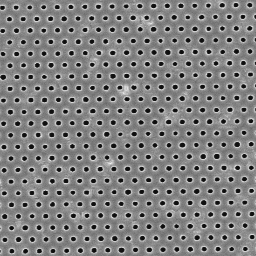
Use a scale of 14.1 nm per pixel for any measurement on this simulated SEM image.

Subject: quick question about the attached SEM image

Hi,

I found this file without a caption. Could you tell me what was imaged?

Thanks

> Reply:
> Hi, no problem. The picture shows a regular array of holes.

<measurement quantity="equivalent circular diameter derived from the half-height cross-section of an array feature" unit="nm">67.6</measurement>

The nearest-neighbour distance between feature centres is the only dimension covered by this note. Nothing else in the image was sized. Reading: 184 nm